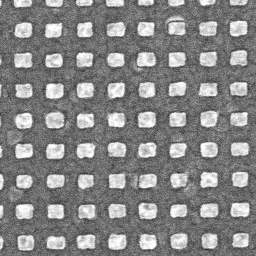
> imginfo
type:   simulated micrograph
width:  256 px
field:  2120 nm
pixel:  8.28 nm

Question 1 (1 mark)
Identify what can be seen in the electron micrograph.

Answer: a regular array of raised bodies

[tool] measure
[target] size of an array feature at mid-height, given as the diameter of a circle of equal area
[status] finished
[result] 131 nm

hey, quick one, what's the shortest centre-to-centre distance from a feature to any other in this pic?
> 249 nm